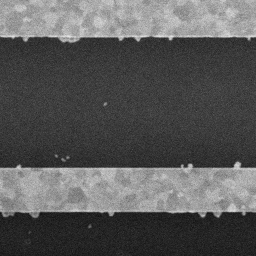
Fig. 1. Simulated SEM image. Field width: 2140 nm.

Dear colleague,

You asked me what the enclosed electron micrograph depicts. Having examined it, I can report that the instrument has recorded lines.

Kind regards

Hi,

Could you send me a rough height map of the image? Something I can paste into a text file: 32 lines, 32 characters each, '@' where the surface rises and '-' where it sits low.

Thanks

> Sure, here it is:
@@@@@@@@@@@@@@@@@@@@@@@@@@@@@@@@
@@@@@@@@@@@@@@@@@@@@@@@@@@@@@@@@
@@@@@@@@@@@@@@@@@@@@@@@@@@@@@@@@
@@@@@@@@@@@@@@@@@@@@@@@@@@@@@@@@
@@@@@@@@@@@@@@@@@@@@@@@@@@@@@@@@
--------------------------------
--------------------------------
--------------------------------
--------------------------------
--------------------------------
--------------------------------
--------------------------------
--------------------------------
--------------------------------
--------------------------------
--------------------------------
--------------------------------
--------------------------------
--------------------------------
--------------------------------
--------------------------------
@@@@@@@@@@@@@@@@@@@@@@@@@@@@@@@@
@@@@@@@@@@@@@@@@@@@@@@@@@@@@@@@@
@@@@@@@@@@@@@@@@@@@@@@@@@@@@@@@@
@@@@@@@@@@@@@@@@@@@@@@@@@@@@@@@@
@@@@@@@@@@@@@@@@@@@@@@@@@@@@@@@@
--@@--------@--------@@@@------@
--------------------------------
--------------------------------
--------------------------------
--------------------------------
--------------------------------